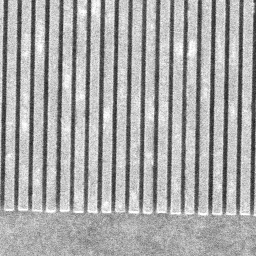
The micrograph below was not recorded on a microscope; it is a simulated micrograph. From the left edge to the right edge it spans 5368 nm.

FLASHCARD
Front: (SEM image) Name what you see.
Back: parallel lines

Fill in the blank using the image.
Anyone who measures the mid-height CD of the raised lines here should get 189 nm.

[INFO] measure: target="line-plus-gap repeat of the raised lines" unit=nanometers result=291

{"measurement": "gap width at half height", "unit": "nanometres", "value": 105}